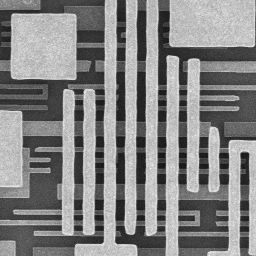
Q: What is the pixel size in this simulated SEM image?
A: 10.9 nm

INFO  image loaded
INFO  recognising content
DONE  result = wiring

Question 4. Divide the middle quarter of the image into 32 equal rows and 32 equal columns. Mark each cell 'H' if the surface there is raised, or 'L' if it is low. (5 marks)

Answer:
HHHLLLLLLLHHHLLLHHLLLHHLLLHHLLLH
HHHLLLLLLLHHHLLHHHLLLHHLLLHHLLLH
HHHLLLLLLLHHHLLHHHLLLHHLLLHHLLLH
HHHLLLLLLLHHHLLHHHLLLHHLLLHHLLLH
LLLLLLLLLLHHHLLHHHLLLHHLLLHHLLLH
LLLLLLLLLLHHHLLHHHLLLHHLLLHHHLLH
HHLLLHHLLLHHHLLHHHLLLHHLLLHHHLLH
HHLLLHHHLLHHHLLHHHLLLHHLLLHHHLLH
HHLLLHHHLLHHHLLHHHLLLHHLLLHHHLLH
HHLLLHHHLLHHHLLHHHLLLHHLLLHHHLLH
HHLLLHHHLLHHHLLHHHLLLHHLLLHHLLLH
HHLLLHHHLLHHHLLHHHLLHHHLLLHHLLLH
HHLLLHHHLLHHHLLLHHLLHHHLLLHHLLLH
HHLLLHHHLLHHHLLLHHLLHHHLLLHHLLLH
HHLLLHHHLLHHHLLLHHLLLHHLLLHHLLLH
HHLLLHHHLLHHHLLHHHLLLHHLLLHHLLLH
HHLLLHHHLLHHHLLHHHLLLHHLLLHHLLLH
HHLLLHHHLLHHHLLHHHLLLHHLLLHHLLLH
HHLLLHHHLLHHHLLHHHLLLHHLLLHHLLLH
HHLLLHHHLLHHHLLHHHLLLHHLLLHHLLLH
HHLLLHHHLLHHHLLHHHLLLHHLLLHHLLLH
HHLLLHHHLLHHHLLHHHLLLHHLLLHHLLLH
HHLLLHHHLLHHHLLHHHLLLHHLLLHHLLLH
HHLLLHHHLLHHHLLHHHLLLHHLLLHHLLLH
HHLLLHHHLLHHHLLHHHLLLHHLLLHHLLLH
HHLLLHHHLLHHHLLHHHLLLHHLLLHHLLLH
HHLLLHHHLLHHHLLHHHLLLHHLLLHHLLLH
HHLLLHHHLLHHHLLHHHLLLHHLLLHHLLLH
HHLLLHHHLLHHHLLHHHLLLHHLLLHHLLLH
HHLLLHHHLLHHHLLHHHLLHHHLLLHHLLLH
HHLLLHHHLLHHHLLHHHLLHHHLLLHHLLLH
HHLLLHHHLLHHHLLHHHLLHHHLLLHHLLLH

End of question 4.